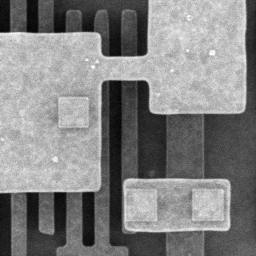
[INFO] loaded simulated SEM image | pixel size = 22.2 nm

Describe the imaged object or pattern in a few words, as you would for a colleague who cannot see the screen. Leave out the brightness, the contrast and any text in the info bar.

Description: wiring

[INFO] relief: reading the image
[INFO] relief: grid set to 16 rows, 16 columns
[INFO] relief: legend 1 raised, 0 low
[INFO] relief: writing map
0000000001111110
0000000001111110
1111110001111110
1111111001111110
1111111111111110
1111110001111110
1111110001111110
1111110000000000
1111110000000000
1111110000000000
1111110000000000
1111110011111100
0000000011111100
0000000011111100
0000000000000000
0000000000000000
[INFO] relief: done